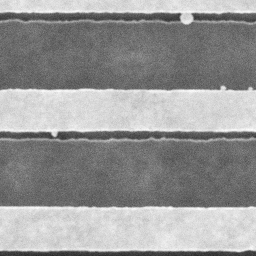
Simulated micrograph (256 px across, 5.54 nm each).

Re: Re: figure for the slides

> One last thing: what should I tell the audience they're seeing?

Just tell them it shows lines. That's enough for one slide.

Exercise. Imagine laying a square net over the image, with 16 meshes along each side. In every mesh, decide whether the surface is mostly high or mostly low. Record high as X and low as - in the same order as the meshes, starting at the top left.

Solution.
XXXXXXXXXXXXXXXX
----------------
----------------
----------------
----------------
----------------
XXXXXXXXXXXXXXXX
XXXXXXXXXXXXXXXX
----------------
----------------
----------------
----------------
----------------
XXXXXXXXXXXXXXXX
XXXXXXXXXXXXXXXX
XXXXXXXXXXXXXXXX